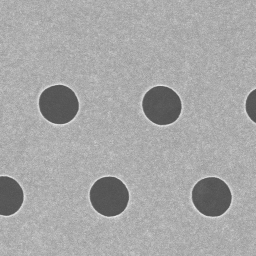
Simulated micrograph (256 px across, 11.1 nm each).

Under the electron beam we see holes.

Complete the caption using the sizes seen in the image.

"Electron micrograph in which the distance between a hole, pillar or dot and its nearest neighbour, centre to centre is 1140 nm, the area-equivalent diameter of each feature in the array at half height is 0.444 µm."